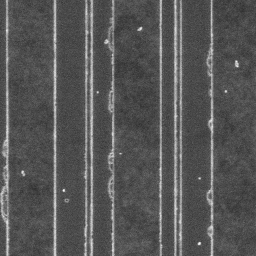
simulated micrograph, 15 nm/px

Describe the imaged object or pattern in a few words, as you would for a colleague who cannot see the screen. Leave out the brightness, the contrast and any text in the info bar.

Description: lines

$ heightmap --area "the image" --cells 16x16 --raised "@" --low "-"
@@@----@@@---@@@
@@@----@@@---@@@
@@@----@@@---@@@
@@@----@@@---@@@
@@@----@@@---@@@
@@@----@@@---@@@
@@@----@@@---@@@
@@@----@@@---@@@
@@@----@@@---@@@
@@@----@@@---@@@
@@@----@@@---@@@
@@@----@@@---@@@
@@@----@@@---@@@
@@@----@@@---@@@
@@@----@@@---@@@
@@@----@@@---@@@